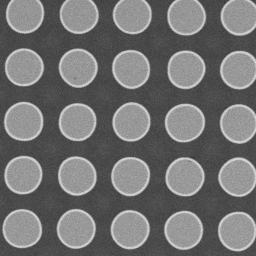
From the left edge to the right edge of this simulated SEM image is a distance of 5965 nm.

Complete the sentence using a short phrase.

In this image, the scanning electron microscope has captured an array of small figures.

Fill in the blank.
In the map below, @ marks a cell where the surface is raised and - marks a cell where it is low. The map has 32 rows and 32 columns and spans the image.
-@@@@---@@@@---@@@@--@@@@---@@@@
-@@@@---@@@@--@@@@@--@@@@@--@@@@
-@@@@---@@@@--@@@@@--@@@@@--@@@@
-@@@@---@@@@---@@@---@@@@---@@@@
--------------------------------
--------------------------------
--@@----@@@----@@-----@@-----@@-
-@@@@---@@@@--@@@@---@@@@---@@@@
-@@@@--@@@@@--@@@@@--@@@@@--@@@@
-@@@@---@@@@--@@@@@--@@@@---@@@@
--@@-----@@----@@@----@@@---@@@-
--------------------------------
--------------------------------
-@@@@---@@@----@@@----@@@----@@-
-@@@@--@@@@@--@@@@@--@@@@---@@@@
-@@@@--@@@@@--@@@@@--@@@@@-@@@@@
-@@@@---@@@@--@@@@---@@@@---@@@@
--@@-----@-----@@-----@@-----@@-
--------------------------------
--------------------------------
-@@@@---@@@----@@@---@@@@---@@@-
-@@@@--@@@@@--@@@@@--@@@@--@@@@@
-@@@@--@@@@@--@@@@@--@@@@--@@@@@
-@@@@---@@@@--@@@@---@@@@---@@@@
-----------------------------@--
--------------------------------
--@@----@@@----@@-----@@--------
-@@@@--@@@@@--@@@@---@@@@---@@@@
@@@@@--@@@@@--@@@@@--@@@@--@@@@@
@@@@@--@@@@@--@@@@---@@@@--@@@@@
-@@@----@@@----@@@---@@@@---@@@-
--------------------------------